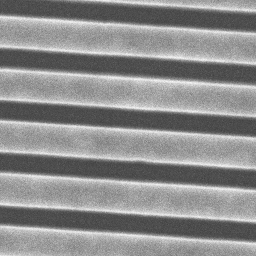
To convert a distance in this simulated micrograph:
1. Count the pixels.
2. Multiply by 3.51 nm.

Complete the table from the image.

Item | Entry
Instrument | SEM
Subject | parallel lines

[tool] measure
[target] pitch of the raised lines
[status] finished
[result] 52.3 px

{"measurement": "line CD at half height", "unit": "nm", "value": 117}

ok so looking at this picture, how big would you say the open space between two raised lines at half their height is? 67 nm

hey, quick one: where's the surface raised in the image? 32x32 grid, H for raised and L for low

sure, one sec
LLLLLLLLLLLLLLLHHHHHHHHHHHHHHHHH
LLLLLLLLLLLLLLLLLLLLLLLLLLLLLLLH
HHHHHHHHHHLLLLLLLLLLLLLLLLLLLLLL
HHHHHHHHHHHHHHHHHHHHHHHHHLLLLLLL
HHHHHHHHHHHHHHHHHHHHHHHHHHHHHHHH
HHHHHHHHHHHHHHHHHHHHHHHHHHHHHHHH
LLLLLLLLHHHHHHHHHHHHHHHHHHHHHHHH
LLLLLLLLLLLLLLLLLLLLLLLHHHHHHHHH
HLLLLLLLLLLLLLLLLLLLLLLLLLLLLLLL
HHHHHHHHHHHHHHHHLLLLLLLLLLLLLLLL
HHHHHHHHHHHHHHHHHHHHHHHHHHHHHLLL
HHHHHHHHHHHHHHHHHHHHHHHHHHHHHHHH
HHHHHHHHHHHHHHHHHHHHHHHHHHHHHHHH
LLLLLLLLLLLLLLLHHHHHHHHHHHHHHHHH
LLLLLLLLLLLLLLLLLLLLLLLLLLLLHHHH
HHHHHHHHLLLLLLLLLLLLLLLLLLLLLLLL
HHHHHHHHHHHHHHHHHHHHHHHLLLLLLLLL
HHHHHHHHHHHHHHHHHHHHHHHHHHHHHHHH
HHHHHHHHHHHHHHHHHHHHHHHHHHHHHHHH
LLLLLLHHHHHHHHHHHHHHHHHHHHHHHHHH
LLLLLLLLLLLLLLLLLLLLLHHHHHHHHHHH
LLLLLLLLLLLLLLLLLLLLLLLLLLLLLLLL
HHHHHHHHHHHHHHHLLLLLLLLLLLLLLLLL
HHHHHHHHHHHHHHHHHHHHHHHHHHHHHLLL
HHHHHHHHHHHHHHHHHHHHHHHHHHHHHHHH
HHHHHHHHHHHHHHHHHHHHHHHHHHHHHHHH
LLLLLLLLLLLLLHHHHHHHHHHHHHHHHHHH
LLLLLLLLLLLLLLLLLLLLLLLLLLLLHHHH
HHHHHHLLLLLLLLLLLLLLLLLLLLLLLLLL
HHHHHHHHHHHHHHHHHHHHHLLLLLLLLLLL
HHHHHHHHHHHHHHHHHHHHHHHHHHHHHHHH
HHHHHHHHHHHHHHHHHHHHHHHHHHHHHHHH